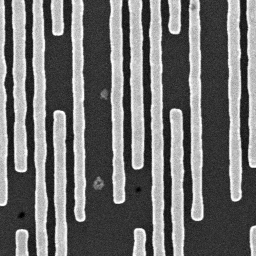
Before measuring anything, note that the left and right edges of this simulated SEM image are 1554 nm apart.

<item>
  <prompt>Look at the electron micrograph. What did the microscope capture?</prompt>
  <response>wiring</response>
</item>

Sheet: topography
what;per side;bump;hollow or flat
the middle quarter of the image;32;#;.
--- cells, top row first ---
..###.......##...###..##........
..##........##...###..##........
..##........##...###..##........
..###.......###..###..##.......#
..###.......###..###..##.......#
..###.......###..###..##........
..###.......##...###..##........
..###.......##...###..##........
..###.......##...###..##........
...##.......##...###..###.......
...##.......##...###..###.......
..###.......###..###..###..##...
..###.......###..###..##...##...
..###.......###..###..###..###..
..###.......###..###..###..###..
..###.......##...###..###..###..
..###.......##...###..###..###..
...##.......##...###..###..###..
...##.......###..###..###..###..
...##.......###..###..###..###..
...##.......###..###..###..###..
...##.......###..###..###..###..
...##.......##...###..###..###..
...##.......###..###..###..###..
...##.......###..###..###..###..
...##.......###..###..###..###..
...##.......###.......###..###..
...##.......###.......###..###..
...##.......###.......###..###..
...##.......###.......###..###..
...##.......###.......###..###..
...##.......###.......###..###..